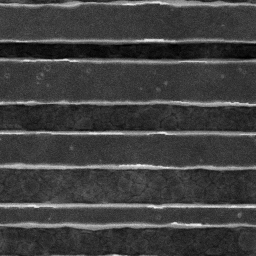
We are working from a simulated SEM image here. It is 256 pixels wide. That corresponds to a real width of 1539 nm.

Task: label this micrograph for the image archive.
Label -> one or a few lines or trenches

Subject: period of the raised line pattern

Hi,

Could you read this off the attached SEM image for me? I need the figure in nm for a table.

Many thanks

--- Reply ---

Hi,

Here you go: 386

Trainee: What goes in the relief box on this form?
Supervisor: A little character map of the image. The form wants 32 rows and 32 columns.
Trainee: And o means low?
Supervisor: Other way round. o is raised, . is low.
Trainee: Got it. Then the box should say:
.........oooooooooooooooo...ooo.
oooooooooooooooooooooooooooooooo
oooooooooooooooooooooooooooooooo
oooooooooooooooooooooooooooooooo
oooooooooooooooooooooooooooooooo
................................
................................
oooooooooooooooo.ooo....oooo...o
oooooooooooooooooooooooooooooooo
oooooooooooooooooooooooooooooooo
oooooooooooooooooooooooooooooooo
oooooooooooooooooooooooooooooooo
oooooooooooooooooooooooooooooooo
................................
................................
................................
...ooo..........................
oooooooooooooooooooooooooooooooo
oooooooooooooooooooooooooooooooo
oooooooooooooooooooooooooooooooo
oooooooooooooooooooooooooooooooo
................................
................................
................................
................................
................................
oooooooooooooooooooooooooooooooo
oooooooooooooooooooooooooooooooo
................................
................................
................................
................................